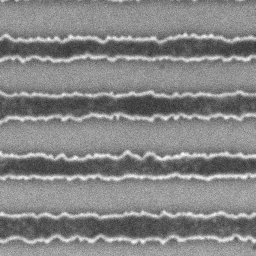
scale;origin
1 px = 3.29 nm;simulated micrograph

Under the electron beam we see lines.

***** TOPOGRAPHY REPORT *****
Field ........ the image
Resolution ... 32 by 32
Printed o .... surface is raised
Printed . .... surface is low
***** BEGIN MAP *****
................................
................................
................................
................................
o.....................ooooo.....
oooooooooooooooooooooooooooooooo
oooooooooooooooooooooooooooooooo
o.oo.oooo.........o....oo...o.o.
................................
................................
................................
..................o.............
oooooooooooooooooooooooooooooooo
oooooooooooooooooooooooooooooooo
oooooooooooooooooooooooooooooooo
................................
................................
................................
................................
oo.ooo.o...ooo.oo.oo..oooooooooo
oooooooooooooooooooooooooooooooo
oooooooooooooooooooooooooooooooo
................................
................................
................................
................................
................................
oooooooooooooooooooooooooooooooo
oooooooooooooooooooooooooooooooo
oooooooooooooooooooooooooooooooo
................................
................................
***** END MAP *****